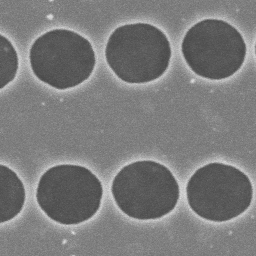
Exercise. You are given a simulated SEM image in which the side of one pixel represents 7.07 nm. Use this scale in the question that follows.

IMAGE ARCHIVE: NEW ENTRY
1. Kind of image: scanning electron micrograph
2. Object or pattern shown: holes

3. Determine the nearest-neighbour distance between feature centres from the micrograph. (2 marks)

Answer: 0.535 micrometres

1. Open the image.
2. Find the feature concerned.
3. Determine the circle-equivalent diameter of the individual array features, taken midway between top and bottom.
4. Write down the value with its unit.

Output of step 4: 0.444 µm